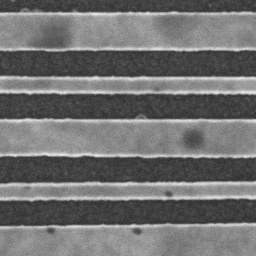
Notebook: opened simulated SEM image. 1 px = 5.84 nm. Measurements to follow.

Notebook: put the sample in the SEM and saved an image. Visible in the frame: lines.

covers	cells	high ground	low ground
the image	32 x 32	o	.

................................
................................
oooooooooooooooooooooooooooooooo
oooooooooooooooooooooooooooooooo
oooooooooooooooooooooooooooooooo
oooooooooooooooooooooooooooooooo
................................
................................
................................
................................
oooooooooooooooooooooooooooooooo
oooooooooooooooooooooooooooooooo
................................
................................
................................
oooooooooooooooooooooooooooooooo
oooooooooooooooooooooooooooooooo
oooooooooooooooooooooooooooooooo
oooooooooooooooooooooooooooooooo
oo......oo.ooooooooooooooooooooo
................................
................................
................................
oooooooooooooooooooooooooooooooo
oooooooooooooooooooooooooooooooo
................................
................................
................................
oooooooooooooooooooooooooooooooo
oooooooooooooooooooooooooooooooo
oooooooooooooooooooooooooooooooo
oooooooooooooooooooooooooooooooo